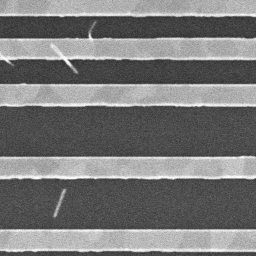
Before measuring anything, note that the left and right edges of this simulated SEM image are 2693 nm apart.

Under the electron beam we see lines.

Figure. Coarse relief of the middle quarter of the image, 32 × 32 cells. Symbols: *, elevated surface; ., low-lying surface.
................................
................................
................................
................................
................................
********************************
********************************
********************************
********************************
********************************
................................
................................
................................
................................
................................
................................
................................
................................
................................
................................
................................
................................
................................
********************************
********************************
********************************
********************************
********************************
.*..............................
................................
................................
................................